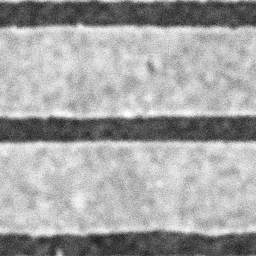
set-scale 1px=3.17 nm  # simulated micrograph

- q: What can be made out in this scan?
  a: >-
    one or a few lines or trenches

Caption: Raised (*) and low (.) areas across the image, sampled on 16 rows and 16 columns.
................
................
****************
****************
****************
****************
****************
................
................
****************
****************
****************
****************
****************
*******.....***.
................